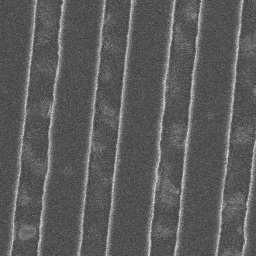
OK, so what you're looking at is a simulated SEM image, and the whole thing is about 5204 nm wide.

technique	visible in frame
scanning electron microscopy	one or a few lines or trenches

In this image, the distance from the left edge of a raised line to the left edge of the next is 1390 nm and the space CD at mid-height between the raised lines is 536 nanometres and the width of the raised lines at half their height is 855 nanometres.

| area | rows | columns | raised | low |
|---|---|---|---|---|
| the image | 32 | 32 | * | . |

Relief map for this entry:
*****...*****...******...*****..
****....*****...******...*****..
****....*****...******...*****..
****....*****...******...*****..
****...******...*****....*****..
****...******...*****....*****..
****...*****....*****....*****..
****...*****....*****...******..
****...*****....*****...*****...
****...*****....*****...*****...
****...*****...******...*****...
***....*****...******...*****...
***....*****...******...*****...
***....*****...******...*****...
***...******...*****....*****...
***...******...*****....*****...
***...*****....*****...******...
***...*****....*****...******...
***...*****....*****...******...
***...*****...******...*****....
***...*****...******...*****....
**....*****...******...*****...*
**....*****...******...*****...*
**...******...*****....*****...*
**...******...*****....*****...*
**...******...*****....*****...*
**...*****....*****....*****...*
**...*****....*****...******...*
**...*****....*****...******...*
**...*****...******...*****....*
**...*****...******...*****....*
*....*****...******...*****...**